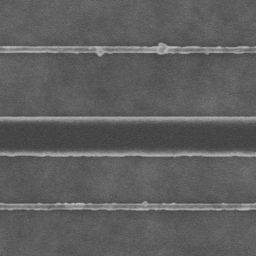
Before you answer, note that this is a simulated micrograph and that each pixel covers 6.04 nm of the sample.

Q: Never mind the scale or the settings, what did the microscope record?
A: lines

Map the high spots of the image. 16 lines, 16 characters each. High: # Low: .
................
................
................
................
................
................
................
################
################
################
................
................
................
................
................
................